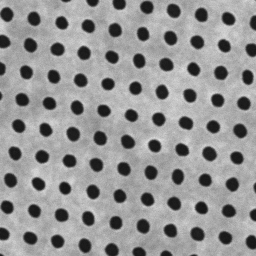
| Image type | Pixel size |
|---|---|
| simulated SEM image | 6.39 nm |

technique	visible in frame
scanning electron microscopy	a regular array of holes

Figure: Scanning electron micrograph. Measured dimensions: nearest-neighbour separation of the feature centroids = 0.172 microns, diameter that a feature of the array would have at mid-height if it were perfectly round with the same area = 87.5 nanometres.